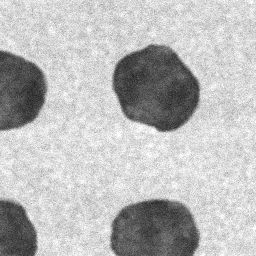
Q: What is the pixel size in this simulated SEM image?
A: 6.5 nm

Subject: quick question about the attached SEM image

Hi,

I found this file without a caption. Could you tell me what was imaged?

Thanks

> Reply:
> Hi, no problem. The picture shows holes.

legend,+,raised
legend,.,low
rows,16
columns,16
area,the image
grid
++++++++++++++++
++++++++++++++++
++++++++++++++++
.+++++++...+++++
...++++.....++++
...++++.....++++
...++++.....++++
..++++++....++++
++++++++++++++++
++++++++++++++++
++++++++++++++++
++++++++++++++++
.++++++++.++++++
..+++++.....++++
..+++++.....++++
..+++++.....++++